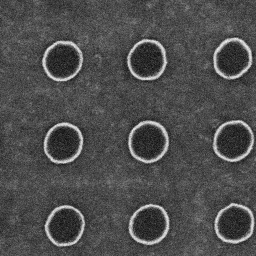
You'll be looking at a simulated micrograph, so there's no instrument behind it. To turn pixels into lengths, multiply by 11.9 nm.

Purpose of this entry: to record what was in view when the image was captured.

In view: a regular array of raised bodies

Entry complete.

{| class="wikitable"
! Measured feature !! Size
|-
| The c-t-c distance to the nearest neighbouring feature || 976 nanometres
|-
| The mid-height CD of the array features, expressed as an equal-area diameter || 0.445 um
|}